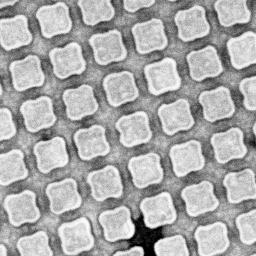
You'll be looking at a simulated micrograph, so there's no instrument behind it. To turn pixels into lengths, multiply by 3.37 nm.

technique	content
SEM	a regular array of raised bodies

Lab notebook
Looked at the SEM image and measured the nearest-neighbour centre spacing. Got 142 nanometres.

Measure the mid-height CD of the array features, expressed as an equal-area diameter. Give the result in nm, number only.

110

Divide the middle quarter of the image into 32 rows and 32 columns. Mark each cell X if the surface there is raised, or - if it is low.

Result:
XXXXX----------------XXXXXXX---X
XXXXX---------------XXXXXXXX----
XX------------XX----XXXXXXXX----
-----------XXXXXX----XXXXXXX----
----------XXXXXXX----XXXXXXXX---
----XX----XXXXXXXX----XXXXXX----
-XXXXXX---XXXXXXXX----XXX-------
XXXXXXX----XXXXXXX--------------
XXXXXXX----XXXXXXX--------------
XXXXXXXX----XXX-------------XXX-
-XXXXXXX-----------------XXXXXX-
-XXXXXXX----------------XXXXXXX-
-XXXXXX-----------XX----XXXXXXXX
--XX----------XXXXXXX---XXXXXXXX
--------------XXXXXXX----XXXXXXX
--------X----XXXXXXXX----XXXXXXX
----XXXXXX----XXXXXXX----XXXX---
---XXXXXXX----XXXXXXXX----------
---XXXXXXX----XXXXXXX-----------
---XXXXXXX-----XXXX------------X
---XXXXXXXX-----X-----------XXXX
----XXXXXXX----------------XXXXX
X---XXXXXX-----------XX----XXXXX
X----XX------------XXXXX---XXXXX
X----------------XXXXXXX---XXXXX
----------------XXXXXXXX---XXXXX
---------XXXX----XXXXXXX---XXXXX
-------XXXXXXX---XXXXXXXX---XX--
------XXXXXXXX---XXXXXXX--------
XXX---XXXXXXXX---XXXXXX---------
XXX----XXXXXXX----XXX-----------
XXX----XXXXXXXX---------------XX